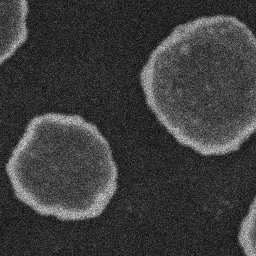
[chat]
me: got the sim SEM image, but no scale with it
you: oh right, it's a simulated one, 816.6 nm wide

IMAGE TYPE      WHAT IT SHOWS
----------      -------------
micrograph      raised bodies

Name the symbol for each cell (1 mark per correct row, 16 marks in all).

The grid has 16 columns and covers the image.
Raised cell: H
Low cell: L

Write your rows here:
HHLLLLLLLLLLLLLL
HHLLLLLLLLLLHHHL
HLLLLLLLLLLHHHHH
LLLLLLLLLLHHHHHH
LLLLLLLLLHHHHHHH
LLLLLLLLLHHHHHHH
LLLLLLLLLLHHHHHH
LLHHHLLLLLHHHHHH
LLHHHHLLLLLHHHHL
LHHHHHHLLLLLLLLL
LHHHHHHLLLLLLLLL
LHHHHHHLLLLLLLLL
LLHHHHLLLLLLLLLL
LLLLHLLLLLLLLLLL
LLLLLLLLLLLLLLLH
LLLLLLLLLLLLLLLH